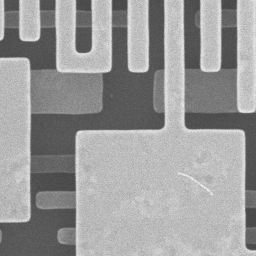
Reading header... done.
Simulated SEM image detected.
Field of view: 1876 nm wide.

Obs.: wiring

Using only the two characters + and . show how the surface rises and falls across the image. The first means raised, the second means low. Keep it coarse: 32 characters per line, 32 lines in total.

..+++..++..+++..++...++..+++..++
..+++..++..+++..++...++..+++..++
..+++..++...++..++...++..+++..++
..+++..++...++..++...++..+++..++
..+++..++...++..+++..++..+++..++
.......++...++..+++..++..+++..++
.......+++.+++..++...++..+++..++
+++....+++++++..++...++..+++..++
++++...+++++++..++...++..+++..++
++++.................++.......++
++++.................++.......++
++++.................++.......++
++++.................++.......++
++++.................++.......++
++++.................++.........
++++.................++.........
++++......++++++++++++++++++++..
++++.....++++++++++++++++++++++.
++++.....++++++++++++++++++++++.
++++.....++++++++++++++++++++++.
++++.....++++++++++++++++++++++.
++++.....++++++++++++++++++++++.
++++.....++++++++++++++++++++++.
++++......+++++++++++++++++++++.
++++......+++++++++++++++++++++.
++++......+++++++++++++++++++++.
++++......+++++++++++++++++++++.
+++.......+++++++++++++++++++++.
..........+++++++++++++++++++++.
..........+++++++++++++++++++++.
..........+++++++++++++++++++++.
..........++++++++++++++++++++++